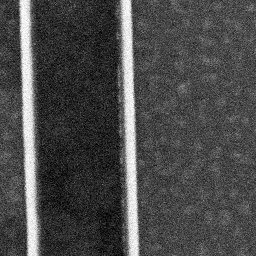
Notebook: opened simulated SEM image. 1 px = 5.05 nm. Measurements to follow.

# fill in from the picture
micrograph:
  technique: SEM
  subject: one or a few lines or trenches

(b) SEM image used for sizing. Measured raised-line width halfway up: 0.522 micrometres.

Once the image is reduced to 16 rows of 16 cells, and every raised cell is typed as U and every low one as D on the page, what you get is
DDUUUUUUDDDDDDDD
DDUUUUUUDDDDDDDD
DDUUUUUUDDDDDDDD
DDUUUUUUDDDDDDDD
DDUUUUUUDDDDDDDD
DDUUUUUUDDDDDDDD
DDUUUUUUDDDDDDDD
DDUUUUUUDDDDDDDD
DDUUUUUUDDDDDDDD
DDUUUUUUDDDDDDDD
DDUUUUUUDDDDDDDD
DDUUUUUUDDDDDDDD
DDUUUUUUDDDDDDDD
DDUUUUUUDDDDDDDD
DDUUUUUUDDDDDDDD
DDUUUUUUDDDDDDDD